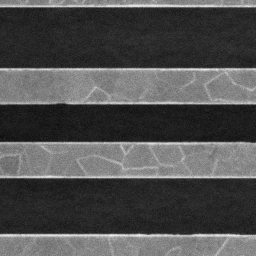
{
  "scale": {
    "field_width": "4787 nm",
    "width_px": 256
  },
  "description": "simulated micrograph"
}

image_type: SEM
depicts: lines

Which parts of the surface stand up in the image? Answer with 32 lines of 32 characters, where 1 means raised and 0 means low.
11111111111111111111111111111111
00000000000000000000000000000000
00000000000000000000000000000000
00000000000000000000000000000000
00000000000000000000000000000000
00000000000000000000000000000000
00000000000000000000000000000000
00000000000000000000000000000000
00000000000000000000000000000000
11111111111111111111111111111111
11111111111111111111111111111111
11111111111111111111111111111111
11111111111111111111111111111111
00000000000000000000000000000000
00000000000000000000000000000000
00000000000000000000000000000000
00000000000000000000000000000000
00000000000000000000000000000000
11111111111111111111111111111111
11111111111111111111111111111111
11111111111111111111111111111111
11111111111111111111111111111111
00000000000000000000000000000000
00000000000000000000000000000000
00000000000000000000000000000000
00000000000000000000000000000000
00000000000000000000000000000000
00000000000000000000000000000000
00000000000000000000000000000000
11111111111111111111111111111111
11111111111111111111111111111111
11111111111111111111111111111111